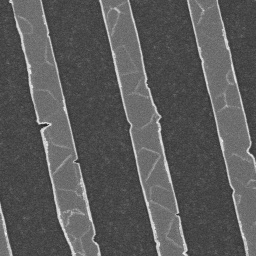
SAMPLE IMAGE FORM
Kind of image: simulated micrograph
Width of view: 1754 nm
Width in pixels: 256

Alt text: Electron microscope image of one or a few lines or trenches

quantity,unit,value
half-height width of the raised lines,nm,198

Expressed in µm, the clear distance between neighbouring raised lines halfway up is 0.389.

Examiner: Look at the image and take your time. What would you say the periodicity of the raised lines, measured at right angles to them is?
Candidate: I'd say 590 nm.